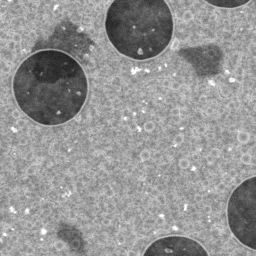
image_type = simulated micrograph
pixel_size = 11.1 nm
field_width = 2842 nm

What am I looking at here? holes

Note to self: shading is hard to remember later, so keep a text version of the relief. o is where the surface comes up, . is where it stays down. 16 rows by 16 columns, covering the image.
ooooooo....ooooo
ooooooo....ooooo
ooooooo....ooooo
oo..oooo..oooooo
o....ooooooooooo
o....ooooooooooo
o....ooooooooooo
oo..oooooooooooo
oooooooooooooooo
oooooooooooooooo
oooooooooooooooo
ooooooooooooooo.
oooooooooooooo..
oooooooooooooo..
ooooooooooooooo.
ooooooooo....ooo